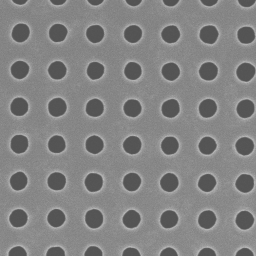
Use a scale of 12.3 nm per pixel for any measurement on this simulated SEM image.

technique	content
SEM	a regular array of holes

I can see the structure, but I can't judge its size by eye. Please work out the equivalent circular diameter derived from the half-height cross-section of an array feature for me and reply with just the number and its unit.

228 nanometres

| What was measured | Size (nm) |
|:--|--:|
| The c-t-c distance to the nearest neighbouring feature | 455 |